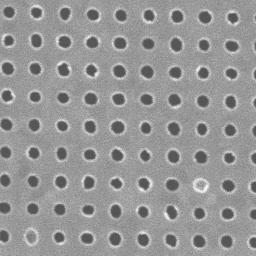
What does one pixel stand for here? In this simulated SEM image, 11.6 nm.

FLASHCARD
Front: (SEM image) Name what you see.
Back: a regular array of holes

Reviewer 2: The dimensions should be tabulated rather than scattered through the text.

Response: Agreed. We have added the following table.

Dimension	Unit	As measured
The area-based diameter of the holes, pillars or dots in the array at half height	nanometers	141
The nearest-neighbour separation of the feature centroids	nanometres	319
